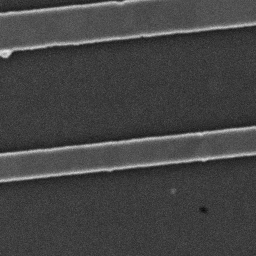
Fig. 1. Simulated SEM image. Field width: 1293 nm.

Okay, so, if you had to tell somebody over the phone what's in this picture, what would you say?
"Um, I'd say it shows one or a few lines or trenches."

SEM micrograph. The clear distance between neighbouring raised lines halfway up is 513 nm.